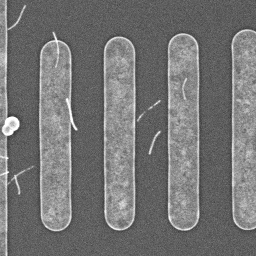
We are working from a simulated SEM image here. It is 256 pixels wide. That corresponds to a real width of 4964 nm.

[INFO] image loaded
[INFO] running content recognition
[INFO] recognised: groups of lines, slits or small figures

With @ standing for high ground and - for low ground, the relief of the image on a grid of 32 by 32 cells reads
@-------------------------------
@-------------------------------
@-------------------------------
@-------------------------------
@---------------------@@-----@@@
@-----@@-----@@@-----@@@@----@@@
@----@@@@----@@@@----@@@@----@@@
@----@@@@----@@@@----@@@@----@@@
@----@@@@----@@@@----@@@@----@@@
@----@@@@----@@@@----@@@@----@@@
@----@@@@----@@@@----@@@@----@@@
@----@@@@----@@@@----@@@@----@@@
@----@@@@----@@@@----@@@@----@@@
@----@@@@----@@@@----@@@@----@@@
@----@@@@----@@@@----@@@@----@@@
@@---@@@@----@@@@----@@@@----@@@
@@---@@@@----@@@@----@@@@----@@@
@----@@@@----@@@@----@@@@----@@@
@----@@@@----@@@@----@@@@----@@@
@----@@@@----@@@@----@@@@----@@@
@----@@@@----@@@@----@@@@----@@@
@----@@@@----@@@@----@@@@----@@@
@----@@@@----@@@@----@@@@----@@@
@----@@@@----@@@@----@@@@----@@@
@----@@@@----@@@@----@@@@----@@@
@----@@@@----@@@@----@@@@----@@@
@----@@@@----@@@@----@@@@----@@@
@----@@@@----@@@@----@@@@----@@@
@-----@@------@@------@@------@@
@-------------------------------
@-------------------------------
@-------------------------------